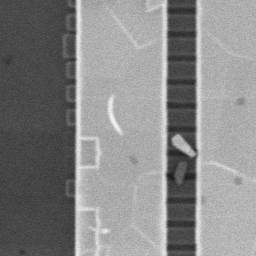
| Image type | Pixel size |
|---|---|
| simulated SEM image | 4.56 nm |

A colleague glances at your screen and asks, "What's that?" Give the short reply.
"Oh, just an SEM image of wiring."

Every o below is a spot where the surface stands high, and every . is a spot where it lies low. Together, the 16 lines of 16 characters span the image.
.....ooooo..oooo
.....ooooo..oooo
.....ooooo..oooo
.....ooooo..oooo
.....ooooo..oooo
.....ooooo..oooo
.....ooooo..oooo
.....ooooo..oooo
.....ooooo..oooo
.....ooooo..oooo
.....ooooo..oooo
.....ooooo..oooo
.....ooooo..oooo
.....ooooo..oooo
.....ooooo..oooo
.....ooooo..oooo